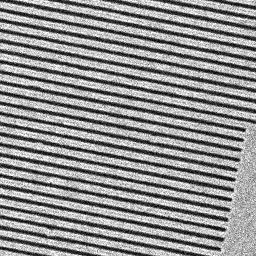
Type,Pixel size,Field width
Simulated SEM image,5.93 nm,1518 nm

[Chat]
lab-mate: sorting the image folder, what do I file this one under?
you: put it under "parallel lines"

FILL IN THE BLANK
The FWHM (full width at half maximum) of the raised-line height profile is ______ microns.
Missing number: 0.0349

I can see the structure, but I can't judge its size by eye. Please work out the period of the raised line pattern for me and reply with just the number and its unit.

60.3 nm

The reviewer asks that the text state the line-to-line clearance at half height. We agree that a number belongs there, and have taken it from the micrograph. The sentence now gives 23.3 nm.